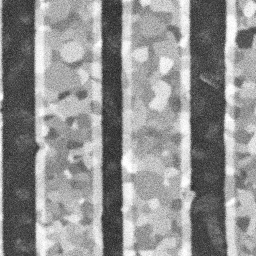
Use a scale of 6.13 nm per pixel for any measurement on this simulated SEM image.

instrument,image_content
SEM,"one or a few lines or trenches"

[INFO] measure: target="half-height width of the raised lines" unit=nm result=360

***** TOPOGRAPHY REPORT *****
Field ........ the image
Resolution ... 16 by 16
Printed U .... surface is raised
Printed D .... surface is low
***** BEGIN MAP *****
DDUUUUDDUUUUDDUU
DDUUUUDDUUUUDDUU
DDUUUUDDUUUUDDUU
DDUUUUDDUUUUDDUU
DDUUUUDDUUUUDDUU
DDDUUUDDUUUUDDUU
DDDUUUDDUUUUDDUU
DDDUUUDDUUUUDDUU
DDDUUUDDUUUUDDUU
DDDUUUDDUUUUDDUU
DDDUUUDDUUUUDDUU
DDDUUUDDUUUUDDUU
DDDUUUDDUUUUDDUU
DDDUUUDDUUUUDDUU
DDDUUUDDUUUUDDUU
DDDUUUDDUUUUDDUU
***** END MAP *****